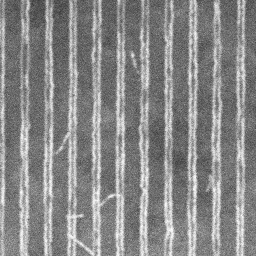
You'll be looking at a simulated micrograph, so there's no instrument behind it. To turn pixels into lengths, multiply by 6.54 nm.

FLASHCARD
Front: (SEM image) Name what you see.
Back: parallel lines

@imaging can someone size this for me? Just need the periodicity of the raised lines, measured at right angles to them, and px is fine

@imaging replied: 24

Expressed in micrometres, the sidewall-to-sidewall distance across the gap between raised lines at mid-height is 0.119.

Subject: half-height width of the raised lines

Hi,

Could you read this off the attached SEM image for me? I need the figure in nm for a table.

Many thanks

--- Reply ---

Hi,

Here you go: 38.4